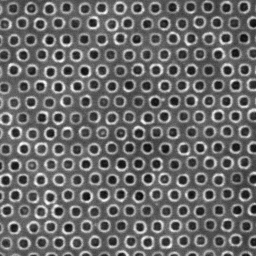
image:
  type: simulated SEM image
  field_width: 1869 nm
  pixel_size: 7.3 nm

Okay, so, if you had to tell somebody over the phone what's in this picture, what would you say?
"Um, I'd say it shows a regular array of holes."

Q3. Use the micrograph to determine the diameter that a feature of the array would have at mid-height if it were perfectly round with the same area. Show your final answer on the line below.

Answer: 9.44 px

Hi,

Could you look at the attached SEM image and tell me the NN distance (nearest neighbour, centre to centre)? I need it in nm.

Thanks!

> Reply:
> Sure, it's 124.